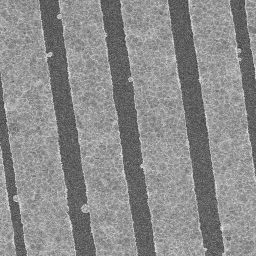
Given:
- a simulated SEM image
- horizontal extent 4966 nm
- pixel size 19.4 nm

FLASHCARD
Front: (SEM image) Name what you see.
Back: one or a few lines or trenches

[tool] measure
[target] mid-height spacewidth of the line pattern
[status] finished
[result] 389 nanometres